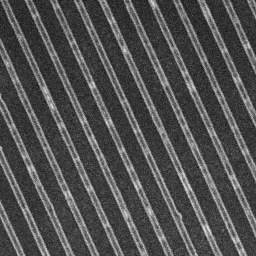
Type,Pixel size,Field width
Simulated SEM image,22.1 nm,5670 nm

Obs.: parallel lines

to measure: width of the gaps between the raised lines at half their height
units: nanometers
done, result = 365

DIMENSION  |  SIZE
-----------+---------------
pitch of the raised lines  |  0.497 um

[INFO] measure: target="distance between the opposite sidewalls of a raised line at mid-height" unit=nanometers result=134